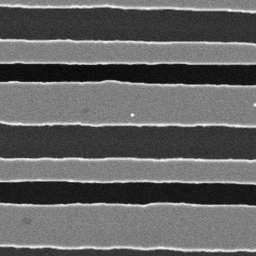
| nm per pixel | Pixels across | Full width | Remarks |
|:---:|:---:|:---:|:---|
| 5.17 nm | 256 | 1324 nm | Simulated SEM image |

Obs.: lines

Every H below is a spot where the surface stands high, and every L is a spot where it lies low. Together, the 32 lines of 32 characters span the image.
HHHHHHHHHHHHHHHHHHHHHHHHHHHHHHHH
LLLLLLLLLLLLLLLLLLLLLLLLLLLLLLLH
LLLLLLLLLLLLLLLLLLLLLLLLLLLLLLLL
LLLLLLLLLLLLLLLLLLLLLLLLLLLLLLLL
LLLLLLLLLLLLLLLLLLLLLLLLLLLLLLLL
HHHHHHHHHHHHHHHHHHHHHHHHHHHHHHHL
HHHHHHHHHHHHHHHHHHHHHHHHHHHHHHHH
HHHHHHHHHHHHHHHHHHHHHHHHHHHHHHHH
LLLLLLLLLLLLLLLLLLLLLLLLLLLLLLLL
LLLLLLLLLLLLLLLLLLLLLLLLLLLLLLLL
HHHHHHHHHHHHHHHHHHLLLLLLLLLLLLLL
HHHHHHHHHHHHHHHHHHHHHHHHHHHHHHHH
HHHHHHHHHHHHHHHHHHHHHHHHHHHHHHHH
HHHHHHHHHHHHHHHHHHHHHHHHHHHHHHHH
HHHHHHHHHHHHHHHHHHHHHHHHHHHHHHHH
LHHHHHHLHLHHHHHHHHHHHHHHHHHHHHHH
LLLLLLLLLLLLLLLLLLLLLLLLLLLLLLLL
LLLLLLLLLLLLLLLLLLLLLLLLLLLLLLLL
LLLLLLLLLLLLLLLLLLLLLLLLLLLLLLLL
LLLLLLLLLLLLLLLLLLLLLLLLLLLLLLLL
HHHHHHHHHHHHHHHHHHHHHHHHHHHHHHHH
HHHHHHHHHHHHHHHHHHHHHHHHHHHHHHHH
HHHHHHHHHHHHHHHHHHHHHHHHHHHHHHHH
LLLLLLLLLLLLLLLLLLLLLLLLLLLLLLLL
LLLLLLLLLLLLLLLLLLLLLLLLLLLLLLLL
HHLLLLLLLHLHHHLLLLLHHHHHLLLLLLLL
HHHHHHHHHHHHHHHHHHHHHHHHHHHHHHHH
HHHHHHHHHHHHHHHHHHHHHHHHHHHHHHHH
HHHHHHHHHHHHHHHHHHHHHHHHHHHHHHHH
HHHHHHHHHHHHHHHHHHHHHHHHHHHHHHHH
HHHHHHHHHHHHHHHHHHHHHHHHHHHHHHHH
LLLLLLLLLLLLLLLLLLLLLLLLLLLLLLLL